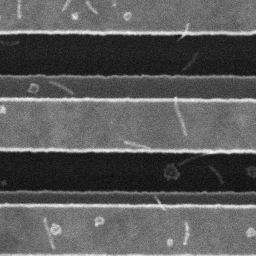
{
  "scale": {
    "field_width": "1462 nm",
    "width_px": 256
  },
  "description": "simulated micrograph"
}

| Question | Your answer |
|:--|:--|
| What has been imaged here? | lines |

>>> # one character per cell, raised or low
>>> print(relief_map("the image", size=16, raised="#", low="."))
################
################
................
................
................
................
################
################
################
........########
................
................
................
################
################
################